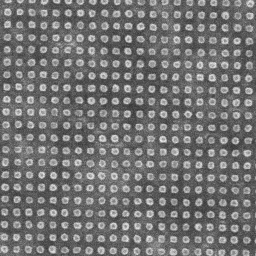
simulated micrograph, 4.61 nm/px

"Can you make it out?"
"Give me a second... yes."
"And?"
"a regular array of raised bodies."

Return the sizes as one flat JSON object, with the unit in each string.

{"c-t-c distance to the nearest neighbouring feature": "0.0547 µm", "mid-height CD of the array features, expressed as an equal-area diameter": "29.9 nm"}